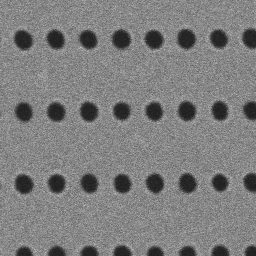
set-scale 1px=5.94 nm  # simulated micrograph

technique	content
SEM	a regular array of holes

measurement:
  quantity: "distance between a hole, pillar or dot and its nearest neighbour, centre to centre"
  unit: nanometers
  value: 193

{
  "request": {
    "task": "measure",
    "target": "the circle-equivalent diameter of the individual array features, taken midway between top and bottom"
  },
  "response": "107 nm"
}